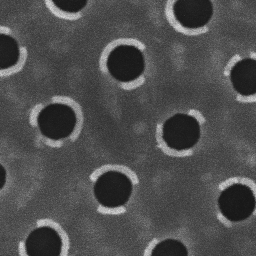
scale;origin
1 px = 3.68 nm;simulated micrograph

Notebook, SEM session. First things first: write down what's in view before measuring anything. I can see holes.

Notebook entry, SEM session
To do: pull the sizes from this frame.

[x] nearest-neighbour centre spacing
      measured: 326 nm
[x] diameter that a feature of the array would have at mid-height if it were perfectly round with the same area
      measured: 0.14 micrometres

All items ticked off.